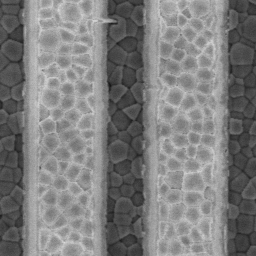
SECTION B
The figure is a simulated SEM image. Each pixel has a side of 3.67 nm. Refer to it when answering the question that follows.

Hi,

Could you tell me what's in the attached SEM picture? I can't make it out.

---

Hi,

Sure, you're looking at one or a few lines or trenches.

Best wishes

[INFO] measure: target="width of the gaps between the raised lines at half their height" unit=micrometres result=0.201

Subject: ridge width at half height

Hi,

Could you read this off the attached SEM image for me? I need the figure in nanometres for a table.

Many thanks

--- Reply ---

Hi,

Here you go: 242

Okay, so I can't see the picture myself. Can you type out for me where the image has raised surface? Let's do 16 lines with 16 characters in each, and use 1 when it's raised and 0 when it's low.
0011110000111100
0011110000111100
0011110000111100
0011110000111100
0011110000111100
0011110000111100
0011110000111100
0011110001111100
0011110000111100
0011110000111100
0011110000111100
0011110000111100
0011110000111100
0011110000111100
0011110000111100
0011110000111100